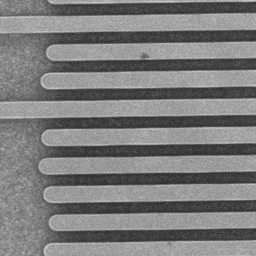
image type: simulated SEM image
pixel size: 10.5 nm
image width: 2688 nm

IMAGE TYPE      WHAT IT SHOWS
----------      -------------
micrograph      groups of lines, slits or small figures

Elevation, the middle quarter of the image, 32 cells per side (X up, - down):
--------------------------------
--------------------------------
XXXXXXXXXXXXXXXXXXXXXXXXXXXXXXXX
XXXXXXXXXXXXXXXXXXXXXXXXXXXXXXXX
XXXXXXXXXXXXXXXXXXXXXXXXXXXXXXXX
XXXXXXXXXXXXXXXXXXXXXXXXXXXXXXXX
--------------------------------
--------------------------------
--------------------------------
XXXXXXXXXXXXXXXXXXXXXXXXXXXXXXXX
XXXXXXXXXXXXXXXXXXXXXXXXXXXXXXXX
XXXXXXXXXXXXXXXXXXXXXXXXXXXXXXXX
XXXXXXXXXXXXXXXXXXXXXXXXXXXXXXXX
--------------------------------
--------------------------------
--------------------------------
XXXXXXXXXXXXXXXXXXXXXXXXXXXXXXXX
XXXXXXXXXXXXXXXXXXXXXXXXXXXXXXXX
XXXXXXXXXXXXXXXXXXXXXXXXXXXXXXXX
XXXXXXXXXXXXXXXXXXXXXXXXXXXXXXXX
--------------------------------
--------------------------------
--------------------------------
XXXXXXXXXXXXXXXXXXXXXXXXXXXXXXXX
XXXXXXXXXXXXXXXXXXXXXXXXXXXXXXXX
XXXXXXXXXXXXXXXXXXXXXXXXXXXXXXXX
XXXXXXXXXXXXXXXXXXXXXXXXXXXXXXXX
--------------------------------
--------------------------------
--------------------------------
----------------------XXXXXXXXXX
XXXXXXXXXXXXXXXXXXXXXXXXXXXXXXXX